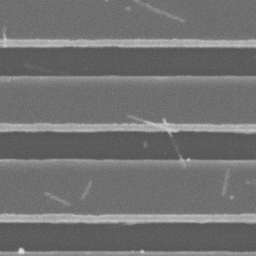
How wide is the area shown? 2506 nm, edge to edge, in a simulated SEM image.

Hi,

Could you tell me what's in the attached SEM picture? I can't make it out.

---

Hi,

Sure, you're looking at lines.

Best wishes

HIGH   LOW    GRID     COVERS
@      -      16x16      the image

@@@@@@@@@@@@@@@@
@@@@@@@@@@@@@@@@
@@@@@@@@@@@@@@@@
----------------
----------------
@@@@@@@@@@@@@@@@
@@@@@@@@@@@@@@@@
@@@@@@@@@@@@@@@@
----------------
----------------
@@@@@@@@@@@@@@@@
@@@@@@@@@@@@@@@@
@@@@@@@@@@@@@@@@
@@@@@@@@@@@@@@@@
----------------
----------------